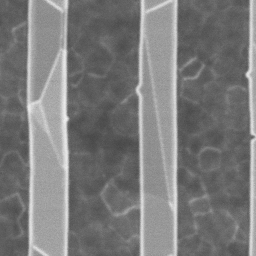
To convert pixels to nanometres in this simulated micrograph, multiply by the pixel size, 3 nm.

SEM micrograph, one or a few lines or trenches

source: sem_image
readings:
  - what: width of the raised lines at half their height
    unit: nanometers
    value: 107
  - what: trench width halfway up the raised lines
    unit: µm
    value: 0.226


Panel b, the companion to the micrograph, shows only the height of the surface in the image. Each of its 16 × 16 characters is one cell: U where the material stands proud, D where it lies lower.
DDUUDDDDDUUDDDDD
DDUUDDDDDUUDDDDD
DDUUDDDDDUUDDDDD
DDUUDDDDDUUDDDDD
DDUUDDDDDUUDDDDD
DDUUDDDDDUUDDDDD
DDUUDDDDDUUDDDDD
DDUUDDDDDUUDDDDD
DDUUDDDDDUUDDDDD
DDUUDDDDDUUDDDDD
DDUUDDDDDUUDDDDD
DDUUDDDDDUUDDDDD
DDUUDDDDDUUDDDDD
DDUUDDDDDUUDDDDD
DDUUDDDDDUUDDDDD
DDUUDDDDDUUDDDDD